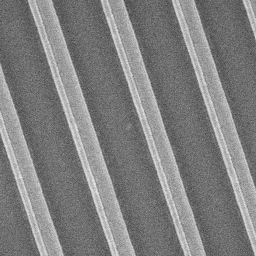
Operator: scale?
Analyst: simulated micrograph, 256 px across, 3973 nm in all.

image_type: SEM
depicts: lines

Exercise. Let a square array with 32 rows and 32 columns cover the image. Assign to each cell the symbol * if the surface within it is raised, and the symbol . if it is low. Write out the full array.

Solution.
....**.......***......**.......*
....***......***......***......*
....***......***......***......*
.....**.......**.......**.......
.....***......***......***......
.....***......***......***......
......***......**.......**......
......***......***......***.....
......***......***......***.....
.......**.......**.......**.....
*......***......***......***....
*......***......***......***....
*.......**.......**.......**....
**......***......***......***...
**......***......***......***...
**.......***......**.......**...
***......***......***......***..
***......***......***......***..
.**.......**.......**.......**..
.***......***......***......**..
.***......***......***......***.
..**.......**.......**.......**.
..***......***......***......**.
..***......***......***......***
...**.......**.......**.......**
...***......***......***......**
...***......***......***......**
....**.......**.......**......**
....***......***......***......*
....***......***......***......*
.....**.......**.......**......*
.....***......***......***......